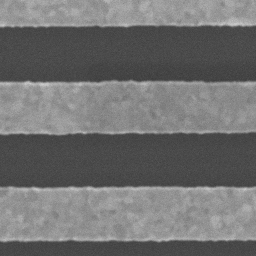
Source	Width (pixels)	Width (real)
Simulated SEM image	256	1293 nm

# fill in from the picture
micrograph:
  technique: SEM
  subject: lines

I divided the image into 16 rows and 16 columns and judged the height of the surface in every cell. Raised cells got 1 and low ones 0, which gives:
1111111111111111
1111111111111111
0000000000000000
0000000000000000
0000000000000000
1111111111111111
1111111111111111
1111111111111111
0000000000000000
0000000000000000
0000000000000000
0000000000000000
1111111111111111
1111111111111111
1111111111111111
0000000000000000